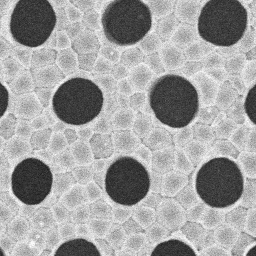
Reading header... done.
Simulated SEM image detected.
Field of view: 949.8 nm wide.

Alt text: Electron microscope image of holes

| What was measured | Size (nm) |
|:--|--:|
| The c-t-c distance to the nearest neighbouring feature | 343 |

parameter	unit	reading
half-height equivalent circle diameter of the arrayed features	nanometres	180